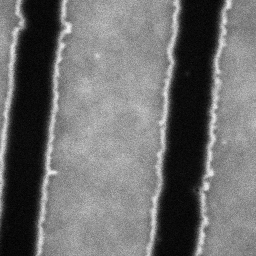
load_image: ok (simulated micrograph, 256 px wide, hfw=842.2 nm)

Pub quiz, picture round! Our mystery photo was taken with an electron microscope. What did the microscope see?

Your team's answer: one or a few lines or trenches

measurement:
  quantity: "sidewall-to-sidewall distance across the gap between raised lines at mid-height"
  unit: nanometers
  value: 358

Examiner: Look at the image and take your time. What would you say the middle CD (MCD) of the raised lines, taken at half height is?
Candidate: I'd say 0.161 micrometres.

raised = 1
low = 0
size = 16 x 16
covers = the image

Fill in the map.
0111000000011100
0111000000011100
0111000000011100
0111000000011100
0111000000011100
0111000000111100
1111000000111000
1110000000111000
1110000000111000
1110000000111000
1110000000111000
1110000000111000
1110000000111000
1110000000111000
1110000001111000
1110000001111000